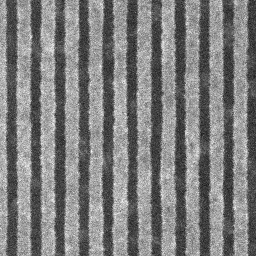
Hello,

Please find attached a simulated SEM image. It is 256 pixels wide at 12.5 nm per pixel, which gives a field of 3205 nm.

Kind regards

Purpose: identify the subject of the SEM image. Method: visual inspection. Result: parallel lines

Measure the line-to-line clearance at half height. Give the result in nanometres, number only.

146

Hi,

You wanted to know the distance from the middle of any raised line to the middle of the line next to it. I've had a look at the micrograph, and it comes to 301 nanometers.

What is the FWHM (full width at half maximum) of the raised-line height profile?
152 nanometres